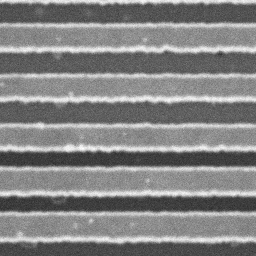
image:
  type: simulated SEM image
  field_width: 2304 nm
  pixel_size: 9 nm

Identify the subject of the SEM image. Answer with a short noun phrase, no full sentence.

lines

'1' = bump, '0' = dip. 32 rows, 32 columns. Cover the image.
00000100000000000000000000000000
00000000000000000000000000000000
00000000000000000000000000000000
11111111111111111111111111111111
11111111111111111111111111111111
11111111111111111111111111111111
10110000010100000011001010100001
00000000000000000000000000000000
00000000000000000000000000000000
11111111111111111111111111111111
11111111111111111111111111111111
11111111111111111111111111111111
11111111111111111111111111111111
00000000000000000000000000000000
00000000000000000000000000000000
00001000000000000010000000000000
11111111111111111111111111111111
11111111111111111111111111111111
11111111111111111111111111111111
00000000000000000000000000000000
00000000000000000000000000000000
11111111111111111111111111111111
11111111111111111111111111111111
11111111111111111111111111111111
10110110111111111101010111010011
00000000000000000000000000000000
00000000000000000000000000000000
11111111111111111111111111111111
11111111111111111111111111111111
11111111111111111111111111111111
00000000000000000000000000000000
00000000000000000000000000000000